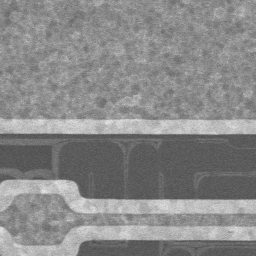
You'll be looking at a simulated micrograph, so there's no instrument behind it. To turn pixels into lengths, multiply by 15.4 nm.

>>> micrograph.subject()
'wiring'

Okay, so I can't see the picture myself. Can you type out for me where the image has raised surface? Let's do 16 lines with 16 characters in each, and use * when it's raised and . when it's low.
****************
****************
****************
****************
****************
****************
****************
****************
................
................
................
................
*****...........
****************
****************
.***............